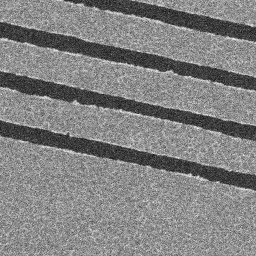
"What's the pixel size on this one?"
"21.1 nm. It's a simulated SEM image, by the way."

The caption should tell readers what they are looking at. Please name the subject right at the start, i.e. parallel lines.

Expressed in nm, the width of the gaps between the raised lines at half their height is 310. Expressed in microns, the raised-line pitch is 1.03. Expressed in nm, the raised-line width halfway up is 672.